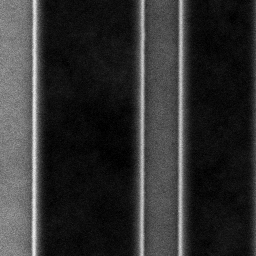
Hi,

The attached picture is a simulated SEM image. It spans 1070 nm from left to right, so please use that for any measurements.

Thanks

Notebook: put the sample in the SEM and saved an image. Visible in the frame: one or a few lines or trenches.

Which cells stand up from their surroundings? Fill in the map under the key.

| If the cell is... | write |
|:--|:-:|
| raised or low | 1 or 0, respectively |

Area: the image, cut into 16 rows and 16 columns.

0011111110011111
0011111110011111
0011111110011111
0011111110011111
0011111110011111
0011111110011111
0011111110011111
0011111110011111
0011111110011111
0011111110011111
0011111110011111
0011111110011111
0011111110011111
0011111110011111
0011111110011111
0011111110011111